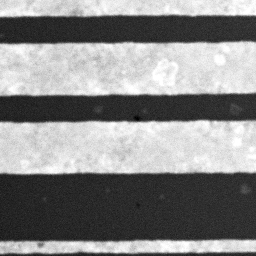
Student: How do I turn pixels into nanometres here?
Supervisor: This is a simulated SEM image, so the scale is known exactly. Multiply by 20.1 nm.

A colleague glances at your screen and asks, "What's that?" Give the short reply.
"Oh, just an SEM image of wiring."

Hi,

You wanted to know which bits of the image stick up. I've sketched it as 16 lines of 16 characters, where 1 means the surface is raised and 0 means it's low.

1111111111111111
0000000000000000
0000000000000000
1111111111111111
1111111111111111
1111111111111111
0000000000000000
0000000000000000
1111111111111111
1111111111111111
1111111111111111
0000000000000000
0000000000000000
0000000000000000
0000000000000000
1111111111111111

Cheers